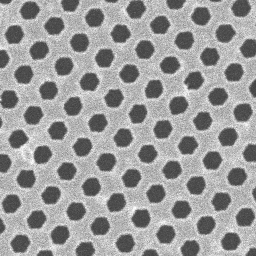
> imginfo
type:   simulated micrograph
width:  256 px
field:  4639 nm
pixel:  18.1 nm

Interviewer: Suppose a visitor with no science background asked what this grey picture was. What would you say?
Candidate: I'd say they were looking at a regular array of holes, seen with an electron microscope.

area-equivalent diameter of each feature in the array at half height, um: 0.351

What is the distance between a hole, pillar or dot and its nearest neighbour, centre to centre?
518 nanometers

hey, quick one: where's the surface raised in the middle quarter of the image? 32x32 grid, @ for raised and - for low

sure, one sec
---@@@@@@---@@@---@@@@@@-----@@@
--@@@@@@@@@@@@-----@@@@@----@@@@
-@@@@---@@@@@@-----@@@@@@@-@@@@-
@@@@-----@@@@@----@@@@@@@@@@@@--
@@@@-----@@@@@@---@@@---@@@@@@--
@@@@----@@@@@@@@@@@@@----@@@@@@-
@@@@@---@@@---@@@@@@-----@@@@@@-
@@@@@@@@@@@----@@@@@----@@@@@@@@
@---@@@@@@-----@@@@@@---@@@---@@
----@@@@@@----@@@@@@@@@@@@-----@
-----@@@@@@---@@@---@@@@@@-----@
----@@@@@@@@@@@@@----@@@@@-----@
@---@@@@--@@@@@@-----@@@@@@--@@@
@@@@@@@---@@@@@@@---@@@@@@@@@@@@
@@@@@@-----@@@@@@---@@@----@@@@@
@@@@@@-----@@@@@@@@@@@@----@@@@@
-@@@@@@---@@@@--@@@@@@-----@@@@@
-@@@@@@@@@@@@----@@@@@@----@@@@@
@@@@--@@@@@@-----@@@@@@---@@@---
@@@----@@@@@@----@@@@@@@@@@@@---
@@-----@@@@@@---@@@@--@@@@@@----
@@-----@@@@@@@@@@@@----@@@@@@---
@@@---@@@---@@@@@@-----@@@@@@---
@@@@@@@@@----@@@@@@----@@@@@@@@@
@@@@@@@@-----@@@@@@---@@@@---@@@
---@@@@@-----@@@@@@@@@@@@----@@@
---@@@@@@---@@@@--@@@@@@------@@
---@@@@@@@@@@@@----@@@@@@----@@@
--@@@@--@@@@@@-----@@@@@@---@@@@
@@@@@----@@@@@@----@@@@@@@@@@@@-
@@@@-----@@@@@@---@@@@---@@@@@--
@@@@@----@@@@@@@@@@@@----@@@@@@-